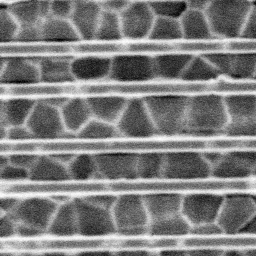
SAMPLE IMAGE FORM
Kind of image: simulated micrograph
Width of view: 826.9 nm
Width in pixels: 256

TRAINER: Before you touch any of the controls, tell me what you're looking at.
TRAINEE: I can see parallel lines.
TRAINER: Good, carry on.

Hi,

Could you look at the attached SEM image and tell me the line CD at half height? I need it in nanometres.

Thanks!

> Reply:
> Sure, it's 43.2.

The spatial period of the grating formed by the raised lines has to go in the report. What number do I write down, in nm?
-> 158